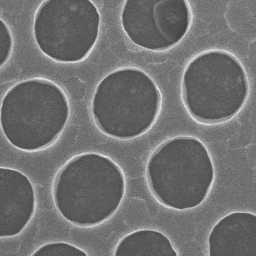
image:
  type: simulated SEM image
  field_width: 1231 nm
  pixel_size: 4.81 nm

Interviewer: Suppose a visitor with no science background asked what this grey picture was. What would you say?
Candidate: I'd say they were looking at holes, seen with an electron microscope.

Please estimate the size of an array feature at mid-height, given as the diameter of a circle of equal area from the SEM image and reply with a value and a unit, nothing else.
328 nanometers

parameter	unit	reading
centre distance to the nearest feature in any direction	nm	436